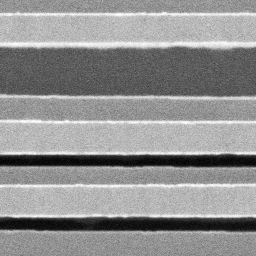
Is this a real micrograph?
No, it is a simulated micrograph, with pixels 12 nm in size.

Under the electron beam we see lines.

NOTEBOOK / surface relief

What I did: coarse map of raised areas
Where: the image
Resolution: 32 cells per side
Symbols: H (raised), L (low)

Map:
HHHHHHHHHHHHHHHHHHHHHHHHHHHHHHHH
HHHHHHHHHHHHHHHHHHHHHHHHHHHHHHHH
HHHHHHHHHHHHHHHHHHHHHHHHHHHHHHHH
HHHHHHHHHHHHHHHHHHHHHHHHHHHHHHHH
HHHHHHHHHHHHHHHHHHHHHHHHHHHHHHHH
HHHHHHHHHHHHHHLLLHHLHLLLLLLLLLLL
LLLLLLLLLLLLLLLLLLLLLLLLLLLLLLLL
LLLLLLLLLLLLLLLLLLLLLLLLLLLLLLLL
LLLLLLLLLLLLLLLLLLLLLLLLLLLLLLLL
LLLLLLLLLLLLLLLLLLLLLLLLLLLLLLLL
LLLLLLLLLLLLLLLLLLLLLLLLLLLLLLLL
LLLLLLLLLLLLLLLLLLLLLLLLLLLLLLLL
HHHHHHHHHHHHHHHHHHHHHHHHHHHHHHHH
HHHHHHHHHHHHHHHHHHHHHHHHHHHHHHHH
HHHHHHHHHHHHHHHHHHHHHHHHHHHHHHHH
HHHHHHHHHHHHHHHHHHHHHHHHHHHHHHHH
HHHHHHHHHHHHHHHHHHHHHHHHHHHHHHHH
HHHHHHHHHHHHHHHHHHHHHHHHHHHHHHHH
HHHHHHHHHHHHHHHHHHHHHHHHHHHHHHHH
LLLLLLLLLLLLLLLLLLLLLLLLLLLLLLLL
LLLLLLLLLLLLLLLLLLLLLLLLLLLLLLLL
HHHHHHHHHHHHHHHHHHHHHHHHHHHHHHHH
HHHHHHHHHHHHHHHHHHHHHHHHHHHHHHHH
HHHHHHHHHHHHHHHHHHHHHHHHHHHHHHHH
HHHHHHHHHHHHHHHHHHHHHHHHHHHHHHHH
HHHHHHHHHHHHHHHHHHHHHHHHHHHHHHHH
HHHHHHHHHHHHHHHHHHHHHHHHHHHHHHHH
LLLLLLLLLLLLLLLLLLLLLLLLLLLLLLLL
LLLLLLLLLLLLLLLLLLLLLLLLLLLLLLLL
HHHHHHHHHHHHHHHHHHHHHHHHHHHHHHHH
HHHHHHHHHHHHHHHHHHHHHHHHHHHHHHHH
HHHHHHHHHHHHHHHHHHHHHHHHHHHHHHHH